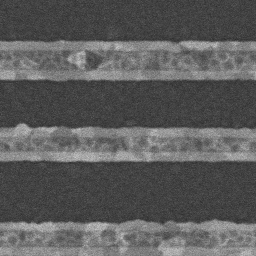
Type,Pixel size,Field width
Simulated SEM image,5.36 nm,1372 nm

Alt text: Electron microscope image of one or a few lines or trenches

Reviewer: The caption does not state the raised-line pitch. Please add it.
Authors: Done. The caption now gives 89.3 pixels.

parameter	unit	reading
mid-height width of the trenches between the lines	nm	336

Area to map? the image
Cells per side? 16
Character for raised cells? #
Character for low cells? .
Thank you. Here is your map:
................
................
................
################
################
................
................
................
################
################
................
................
................
................
################
################